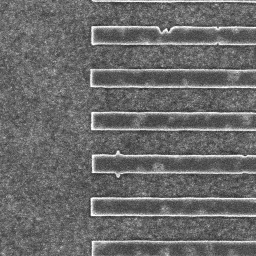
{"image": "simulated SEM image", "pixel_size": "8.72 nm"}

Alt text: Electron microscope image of parallel lines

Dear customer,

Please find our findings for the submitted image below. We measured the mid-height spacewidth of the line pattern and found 25 px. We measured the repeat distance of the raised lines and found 373 nm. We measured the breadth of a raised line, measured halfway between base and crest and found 156 nm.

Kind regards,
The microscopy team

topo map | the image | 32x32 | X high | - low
--------------------------------
--------------------------------
--------------------------------
------------XXXXXXXX--XXXXXXXXXX
------------XXXXXXXXXXXXXXXXXXXX
---------------XXXX--------XXXXX
--------------------------------
--------------------------------
--------------------------------
-----------XXXXXXXXXXXXXXXXXXXXX
-----------XXXXXXXXXXXXXXXXXXXXX
--------------------------------
--------------------------------
--------------------------------
-----------XXXXXXXXXXXXXXXXXXXXX
-----------XXXXXXXXXXXXXXXXXXXXX
--------------------------------
--------------------------------
--------------------------------
------------XXXXXXXXXXXXXXXX-X--
------------XXXXXXXXXXXXXXXXXXXX
------------XXXXXXXXXXXXXXXXXXXX
--------------------------------
--------------------------------
--------------------------------
-----------XXXXXXXXXXXXXXXXXXXXX
-----------XXXXXXXXXXXXXXXXXXXXX
--------------------------------
--------------------------------
--------------------------------
------------XXXXXXXXXXXXXXXXXXXX
------------XXXXXXXXXXXXXXXXXXXX